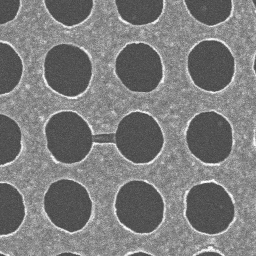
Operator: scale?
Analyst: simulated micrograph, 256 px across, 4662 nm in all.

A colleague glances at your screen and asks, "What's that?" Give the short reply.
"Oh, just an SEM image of holes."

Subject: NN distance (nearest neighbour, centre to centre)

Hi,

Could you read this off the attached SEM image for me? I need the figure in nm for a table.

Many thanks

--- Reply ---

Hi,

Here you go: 1300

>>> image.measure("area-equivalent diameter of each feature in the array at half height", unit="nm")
906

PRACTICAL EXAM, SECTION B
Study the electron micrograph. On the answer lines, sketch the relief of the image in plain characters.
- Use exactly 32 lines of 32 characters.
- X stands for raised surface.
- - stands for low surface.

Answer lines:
--XXXX------XX------XXX------XXX
--XXXX-----XXXX-----XXXX-----XXX
-XXXXXX----XXXXX---XXXXXX---XXXX
XXXXXXXXXXXXXXXXXXXXXXXXXXXXXXXX
XXXXXXXXXXXXXXXXXXXXXXXXXXXXXXXX
-XXXXXXXXXXXXXXX--XXXXXXX---XXXX
--XXXX-----XXXX-----XXXX-----XXX
---XXX-----XXX------XXXX-----XXX
---XX------XXX------XXXX-----XXX
---XXX-----XXXX-----XXXX-----XXX
--XXXX-----XXXX-----XXXX-----XXX
-XXXXXX---XXXXXXX--XXXXXXXXXXXXX
XXXXXXXXXXXXXXXXXXXXXXXXXXXXXXXX
XXXXXXXXXXXXXXXXXXXXXXXXXXXXXXXX
-XXXXXX---XXXXXX---XXXXX----XXXX
--XXXX-----XXXX-----XXXX-----XXX
---XXX------XX------XXX------XXX
---XXX--------------XXX------XXX
---XXX-----XXXX-----XXXX-----XXX
--XXXXX----XXXXX---XXXXX-----XXX
-XXXXXXXXXXXXXXXXXXXXXXXXXXXXXXX
XXXXXXXXXXXXXXXXXXXXXXXXXXXXXXXX
XXXXXXX-XXXXXXXXXXXXXXXXXXXXXXXX
--XXXX-----XXXX----XXXXX----XXXX
---XXX-----XXXX-----XXX------XXX
---XX------XXX------XXX------XXX
---XXX-----XXX------XXX------XXX
---XXX-----XXXX-----XXX------XXX
--XXXXX---XXXXXX----XXXX----XXXX
XXXXXXXXXXXXXXXXXXXXXXXXXXXXXXXX
XXXXXXXXXXXXXXXXXXXXXXXXXXXXXXXX
XXXXXXXXXXXXXXXXX-XXXXXXXX-XXXXX